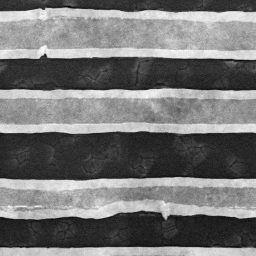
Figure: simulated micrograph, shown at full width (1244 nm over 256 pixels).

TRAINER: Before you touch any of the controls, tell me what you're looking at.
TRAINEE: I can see one or a few lines or trenches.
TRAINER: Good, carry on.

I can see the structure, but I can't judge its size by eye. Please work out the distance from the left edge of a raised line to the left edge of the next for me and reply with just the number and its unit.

0.396 micrometres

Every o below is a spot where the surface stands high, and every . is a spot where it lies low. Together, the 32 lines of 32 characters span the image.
................................
......oo........................
oooooooooooooooooooooooooooooooo
oooooooooooooooooooooooooooooooo
oooooooooooooooooooooooooooooooo
oooooooooooooooooooooooooooooooo
oooooooooooooooooooooooooooooooo
................................
................................
................................
................................
................................
oooooooooooooooooooooooooooooooo
oooooooooooooooooooooooooooooooo
oooooooooooooooooooooooooooooooo
oooooooooooooooooooooooooooooooo
................................
................................
................................
................................
................................
................................
................................
oooooooooooooooooooooooooooooooo
oooooooooooooooooooooooooooooooo
oooooooooooooooooooooooooooooooo
ooooooooooooo.............oooooo
................................
................................
................................
................................
o.........ooooooooooooooooo.oooo